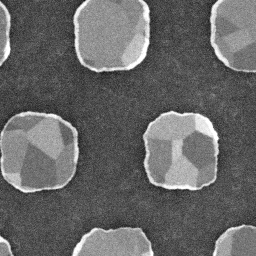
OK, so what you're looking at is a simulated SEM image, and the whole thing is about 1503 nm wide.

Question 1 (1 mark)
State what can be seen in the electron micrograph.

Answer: raised bodies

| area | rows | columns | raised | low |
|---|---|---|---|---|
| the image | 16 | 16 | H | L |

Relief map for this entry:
LLLLLHHHHLLLLHHH
HLLLLHHHHLLLLHHH
HLLLLHHHHLLLLHHH
LLLLLHHHHLLLLLHH
LLLLLLLLLLLLLLLL
LLLLLLLLLLLLLLLL
LLLLLLLLLLLLLLLL
LHHHLLLLLLHHHLLL
HHHHHLLLLHHHHLLL
HHHHHLLLLHHHHHLL
HHHHHLLLLHHHHHLL
LHHHLLLLLLHHHLLL
LLLLLLLLLLLLLLLL
LLLLLLLLLLLLLLLL
LLLLLLHHHLLLLLHH
HLLLLHHHHLLLLHHH